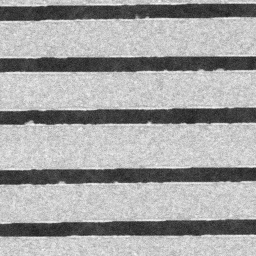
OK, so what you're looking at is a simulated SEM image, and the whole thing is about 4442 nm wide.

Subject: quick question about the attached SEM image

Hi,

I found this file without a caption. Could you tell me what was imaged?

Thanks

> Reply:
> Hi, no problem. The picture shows lines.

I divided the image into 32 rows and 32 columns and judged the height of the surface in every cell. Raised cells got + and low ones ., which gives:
+++++++++++++++.................
................................
.........+.+++++++++++++++++++++
++++++++++++++++++++++++++++++++
++++++++++++++++++++++++++++++++
++++++++++++++++++++++++++++++++
++++++++++++++++++++++++++++++++
................................
................................
++++++++++++++++++++++++++++++++
++++++++++++++++++++++++++++++++
++++++++++++++++++++++++++++++++
++++++++++++++++++++++++++++++++
++++++++++++++++++++............
................................
..........................++++++
++++++++++++++++++++++++++++++++
++++++++++++++++++++++++++++++++
++++++++++++++++++++++++++++++++
++++++++++++++++++++++++++++++++
++++++++++++++++++++++++++++++++
................................
................................
++++++++++++++++++++++++++++++++
++++++++++++++++++++++++++++++++
++++++++++++++++++++++++++++++++
++++++++++++++++++++++++++++++++
++++++++++++++++++++............
................................
.........................+++++++
++++++++++++++++++++++++++++++++
++++++++++++++++++++++++++++++++